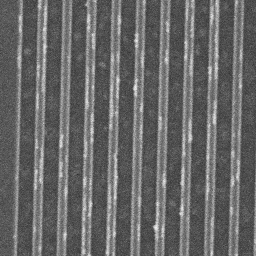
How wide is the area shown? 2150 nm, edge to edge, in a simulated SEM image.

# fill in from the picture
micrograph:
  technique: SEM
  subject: parallel lines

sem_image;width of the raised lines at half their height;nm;69.3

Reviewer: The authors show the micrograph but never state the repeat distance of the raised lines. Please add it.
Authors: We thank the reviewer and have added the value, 206 nm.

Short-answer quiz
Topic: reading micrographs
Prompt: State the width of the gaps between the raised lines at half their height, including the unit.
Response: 131 nm